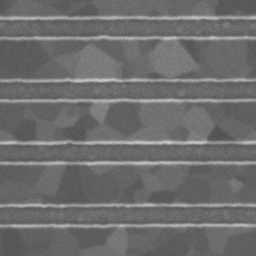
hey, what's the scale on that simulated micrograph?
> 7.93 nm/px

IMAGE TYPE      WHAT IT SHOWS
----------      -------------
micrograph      parallel lines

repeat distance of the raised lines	62.5	px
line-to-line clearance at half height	158	nanometers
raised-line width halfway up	337	nm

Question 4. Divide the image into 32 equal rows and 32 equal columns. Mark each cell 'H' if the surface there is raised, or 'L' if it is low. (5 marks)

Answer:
HHHHHHHHHHHHHHHHHHHHHHHHHHHHHHHH
HHHHHHHHHHHHHHHHHHHHHHHHHHHHHHHH
LLLLLLLLLLLLLLLLLLLLLLLLLLLLLLLL
LLLLLLLLLLLLLLLLLLLLLLLLLLLLLLLL
LLLLLLLLLLLLLLLLLLLLLLLLLLLLLLLL
HHHHHHHHHHHHHHHHHHHHHHHHHHHHHHHH
HHHHHHHHHHHHHHHHHHHHHHHHHHHHHHHH
HHHHHHHHHHHHHHHHHHHHHHHHHHHHHHHH
HHHHHHHHHHHHHHHHHHHHHHHHHHHHHHHH
HHHHHHHHHHHHHHHHHHHHHHHHHHHHHHHH
LLLLLLLLLLLLLLLLLLLLLLLLLLLLLLLL
LLLLLLLLLLLLLLLLLLLLLLLLLLLLLLLL
LLLLLLLLLLLLLLLLLLLLLLLLLLLLLLLL
HHHHHHHHHHHHHHHHHHHHHHHHHHHHHHHH
HHHHHHHHHHHHHHHHHHHHHHHHHHHHHHHH
HHHHHHHHHHHHHHHHHHHHHHHHHHHHHHHH
HHHHHHHHHHHHHHHHHHHHHHHHHHHHHHHH
HHHHHHHHHHHHHHHHHHHHHHHHHHHHHHHH
LLLLLLLLLLLLLLLLLLLLLLLLLLLLLLLL
LLLLLLLLLLLLLLLLLLLLLLLLLLLLLLLL
HHLLHHHHHHHHHHHHHHHHHHHHHHHHHHHH
HHHHHHHHHHHHHHHHHHHHHHHHHHHHHHHH
HHHHHHHHHHHHHHHHHHHHHHHHHHHHHHHH
HHHHHHHHHHHHHHHHHHHHHHHHHHHHHHHH
HHHHHHHHHHHHHHHHHHHHHHHHHHHHHHHH
HHHHHHHHHHHHHHHHHHHHHHHHHHHHHHHH
LLLLLLLLLLLLLLLLLLLLLLLLLLLLLLLL
LLLLLLLLLLLLLLLLLLLLLLLLLLLLLLLL
HHHHHHHHHHHHHHHHHHHHHHHHHHHHHHHH
HHHHHHHHHHHHHHHHHHHHHHHHHHHHHHHH
HHHHHHHHHHHHHHHHHHHHHHHHHHHHHHHH
HHHHHHHHHHHHHHHHHHHHHHHHHHHHHHHH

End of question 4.